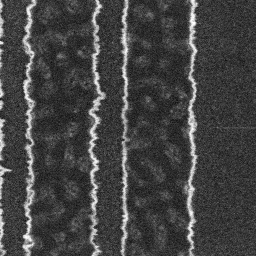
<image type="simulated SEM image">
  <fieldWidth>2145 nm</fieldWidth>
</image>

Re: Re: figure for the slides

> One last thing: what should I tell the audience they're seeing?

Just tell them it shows one or a few lines or trenches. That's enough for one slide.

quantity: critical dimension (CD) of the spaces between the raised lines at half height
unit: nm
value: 223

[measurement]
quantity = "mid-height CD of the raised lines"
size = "579 nanometres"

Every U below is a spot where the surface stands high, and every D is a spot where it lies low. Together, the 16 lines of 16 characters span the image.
DDUUUUDDUUUUDDDD
DDUUUUDDUUUUDDDD
DDUUUUDDUUUUDDDD
DDUUUUDDUUUUDDDD
DDUUUUDDUUUUDDDD
DUUUUUDDUUUUDDDD
DDUUUUDDUUUUDDDD
DDUUUUDDUUUUDDDD
DDUUUUDDUUUUDDDD
DDUUUUDDUUUUDDDD
DDUUUUDDUUUUDDDD
DDUUUUDDUUUUDDDD
DDUUUUDDUUUUDDDD
DDUUUUDDUUUUDDDD
DDUUUUDDUUUUDDDD
DDUUUUDDUUUUDDDD